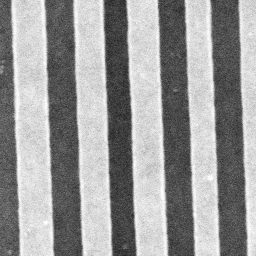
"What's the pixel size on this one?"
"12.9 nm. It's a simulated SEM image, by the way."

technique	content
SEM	lines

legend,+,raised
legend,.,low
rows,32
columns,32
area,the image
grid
..++++...++++...++++...+++....++
..++++...++++...++++...+++....++
..++++...++++...++++...+++....++
..++++...++++...++++...+++....++
..++++...++++...++++...+++....++
..++++...++++...++++...+++....++
..++++...++++...++++...+++....++
..++++...++++...++++...+++....++
..++++...++++...++++....+++...++
..++++...++++...++++....+++...++
..++++....+++...++++....+++...++
..++++....+++...++++....+++...++
..++++....+++...++++....+++...++
..++++....+++...++++....+++...++
..++++....+++....+++....+++...++
..++++....+++....+++....+++...++
..++++....+++....+++....+++....+
..++++....+++....+++....+++....+
..++++....+++....+++....+++....+
..++++....++++...+++....+++....+
..++++....++++...+++....+++....+
..++++....++++...+++....+++....+
..++++....++++...+++....+++....+
..++++....++++...+++....+++....+
..++++....++++...++++...+++....+
..++++....++++...++++...+++....+
..++++....++++...++++...+++....+
..++++....++++...++++...+++....+
...+++....++++...++++...+++....+
...++++...++++...++++...+++....+
...++++...++++...++++...+++....+
...++++...++++...++++...+++....+